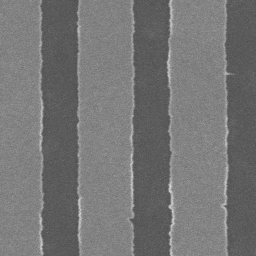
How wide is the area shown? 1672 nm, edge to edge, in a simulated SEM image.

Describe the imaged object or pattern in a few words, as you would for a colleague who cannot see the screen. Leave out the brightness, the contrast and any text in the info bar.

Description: one or a few lines or trenches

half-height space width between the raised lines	241	nm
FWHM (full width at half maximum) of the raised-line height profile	0.36	um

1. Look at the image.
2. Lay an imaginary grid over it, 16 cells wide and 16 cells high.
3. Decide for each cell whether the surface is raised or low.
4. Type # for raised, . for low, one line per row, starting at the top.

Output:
###..###...###..
###..###...###..
###..###...###..
###..###...###..
###..###...###..
###..###...###..
###..###...###..
###..###...###..
###..###...###..
###..###...###..
###..###...###..
###..###...###..
###..###...###..
###..###...###..
###..###...###..
###..###...###..